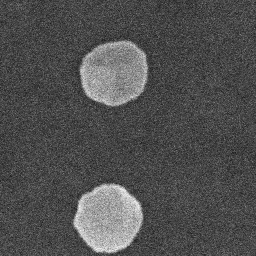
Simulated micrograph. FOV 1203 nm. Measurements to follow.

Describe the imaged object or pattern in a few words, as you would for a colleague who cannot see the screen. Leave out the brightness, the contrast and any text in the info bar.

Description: raised bodies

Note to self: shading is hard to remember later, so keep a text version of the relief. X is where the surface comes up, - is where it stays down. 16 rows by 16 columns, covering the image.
----------------
----------------
----------------
-----XXXX-------
-----XXXX-------
-----XXXX-------
----------------
----------------
----------------
----------------
----------------
----------------
-----XXX--------
-----XXXX-------
-----XXXX-------
------XX--------